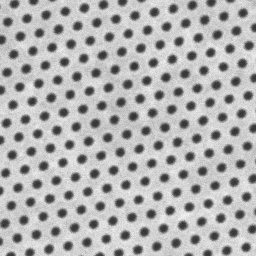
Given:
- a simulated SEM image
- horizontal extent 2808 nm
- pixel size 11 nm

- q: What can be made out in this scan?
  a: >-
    a regular array of holes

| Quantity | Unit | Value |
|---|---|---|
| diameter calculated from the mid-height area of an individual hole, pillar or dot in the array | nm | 116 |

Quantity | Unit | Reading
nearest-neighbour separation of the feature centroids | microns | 0.208